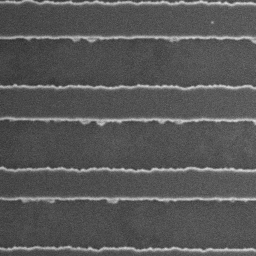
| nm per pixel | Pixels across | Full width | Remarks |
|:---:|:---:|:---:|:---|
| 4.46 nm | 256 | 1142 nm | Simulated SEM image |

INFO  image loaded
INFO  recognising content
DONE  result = lines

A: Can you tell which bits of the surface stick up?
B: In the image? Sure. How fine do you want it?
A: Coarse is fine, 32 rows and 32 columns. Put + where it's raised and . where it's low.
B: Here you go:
++++++++++++++++++++++++++++++++
++++++++++++++++++++++++++++++++
++++++++++++++++++++++++++++++++
++++++++++++++++++++++++++++++++
++++++++++++++++++++++++++++++++
................................
................................
................................
................................
................................
................................
++++++++++++++++++++++++++++++++
++++++++++++++++++++++++++++++++
++++++++++++++++++++++++++++++++
++++++++++++++++++++++++++++++++
................................
................................
................................
................................
................................
................................
++++++++++++++++++++++++++++++++
++++++++++++++++++++++++++++++++
++++++++++++++++++++++++++++++++
++++++++++++++++++++++++++++++++
................................
................................
................................
................................
................................
................................
++++++++++++++++++++++++++++++++